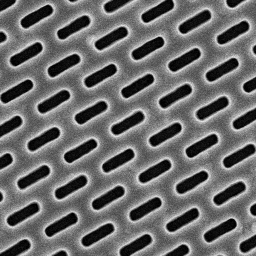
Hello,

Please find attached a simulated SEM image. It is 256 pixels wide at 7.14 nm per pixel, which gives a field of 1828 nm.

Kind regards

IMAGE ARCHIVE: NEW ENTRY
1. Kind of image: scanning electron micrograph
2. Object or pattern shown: a regular array of holes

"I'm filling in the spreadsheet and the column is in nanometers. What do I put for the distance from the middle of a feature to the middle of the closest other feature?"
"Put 273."